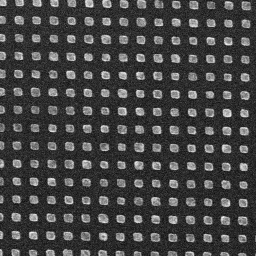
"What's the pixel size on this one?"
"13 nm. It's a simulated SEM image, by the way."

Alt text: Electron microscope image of a regular array of raised bodies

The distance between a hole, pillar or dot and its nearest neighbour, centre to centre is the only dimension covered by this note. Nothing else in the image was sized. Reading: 225 nm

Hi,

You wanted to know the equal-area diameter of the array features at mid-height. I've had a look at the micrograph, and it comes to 0.106 µm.